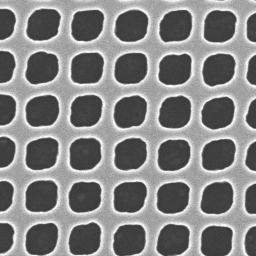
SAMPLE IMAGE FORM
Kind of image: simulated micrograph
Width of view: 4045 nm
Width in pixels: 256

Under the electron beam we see a regular array of holes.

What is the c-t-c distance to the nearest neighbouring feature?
676 nm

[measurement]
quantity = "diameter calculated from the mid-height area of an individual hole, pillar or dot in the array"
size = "535 nanometers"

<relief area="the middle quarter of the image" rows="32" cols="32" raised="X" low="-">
XX--------XXX--------XXX--------
XX--------XX---------XXX--------
XX--------XX---------XXX--------
XX-------XXXX-------XXXX-------X
XX------XXXXXX-----XXXXX------XX
XXXXXXXXXXXXXXXXXXXXXXXXXXXXXXXX
XXXXXXXXXXXXXXXXXXXXXXXXXXXXXXXX
XXXXXXXXXXXXXXXXXXXXXXXXXXXXXXXX
XXX------XXXXXX-----XXXXXX-----X
XX--------XXX--------XXXX-------
XX--------XXX--------XXX--------
XX--------XXX--------XXX--------
XX--------XXX-------XXXX--------
X--------XXX--------XXX---------
XX-------XXXX-------XXXX-------X
XXX----XXXXXX-----XXXXXXX-----XX
XXXXXXXXXXXXXXXXXXXXXXXXXXXXXXXX
XXXXXXXXXXXXXXXXXXXXXXXXXXXXXXXX
XXXX-XXXXXXXXXXX---XXXXXXXXXXXXX
XX-------XXXXX------XXXXX------X
XX-------XXXX--------XXX--------
X--------XXXX--------XXX--------
X--------XXXX--------XX---------
X--------XXXX--------XX--------X
X--------XXXX-------XXXX-------X
XX------XXXXX------XXXXX------XX
XXX--XXXXXXXXX----XXXXXXX---XXXX
XXXXXXXXXXXXXXXXXXXXXXXXXXXXXXXX
XXXXXXXXXXXXXXXXXXXXXXXXXXXXXXXX
XXX-----XXXXXXXX---XXXXXXXX---XX
XX-------XXXX-------XXXX-------X
X--------XXX---------XX--------X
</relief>